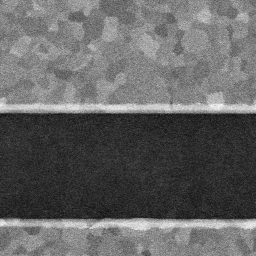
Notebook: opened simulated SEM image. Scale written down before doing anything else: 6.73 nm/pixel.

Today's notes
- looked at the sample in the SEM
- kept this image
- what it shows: one or a few lines or trenches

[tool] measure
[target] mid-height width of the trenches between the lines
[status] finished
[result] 782 nanometres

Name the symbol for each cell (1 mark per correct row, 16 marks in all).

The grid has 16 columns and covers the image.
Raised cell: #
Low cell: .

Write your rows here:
################
################
################
################
################
################
################
................
................
................
................
................
................
................
################
################